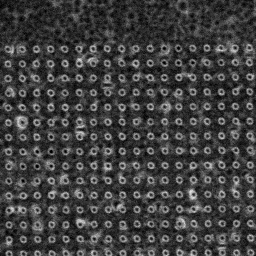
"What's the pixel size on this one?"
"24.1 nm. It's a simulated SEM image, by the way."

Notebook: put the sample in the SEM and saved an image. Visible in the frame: a regular array of raised bodies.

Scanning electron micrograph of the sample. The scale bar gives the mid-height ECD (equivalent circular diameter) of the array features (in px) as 5.75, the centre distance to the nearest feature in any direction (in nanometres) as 335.